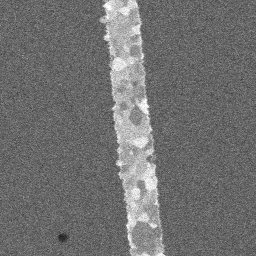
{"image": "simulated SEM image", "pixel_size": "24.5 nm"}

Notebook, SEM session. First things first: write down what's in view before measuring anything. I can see one or a few lines or trenches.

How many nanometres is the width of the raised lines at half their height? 789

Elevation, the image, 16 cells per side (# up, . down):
.......##.......
.......##.......
.......##.......
.......##.......
.......##.......
.......##.......
.......##.......
.......##.......
.......##.......
.......###......
.......###......
........##......
........##......
........##......
........##......
........##......